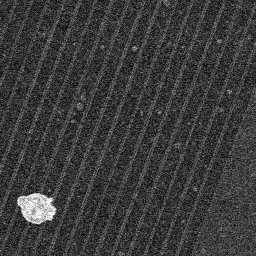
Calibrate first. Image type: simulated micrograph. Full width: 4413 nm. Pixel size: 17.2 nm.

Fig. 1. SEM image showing parallel lines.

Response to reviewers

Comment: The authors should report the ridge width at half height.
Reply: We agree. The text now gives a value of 0.0404 µm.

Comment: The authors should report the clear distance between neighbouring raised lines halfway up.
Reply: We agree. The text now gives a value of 0.218 microns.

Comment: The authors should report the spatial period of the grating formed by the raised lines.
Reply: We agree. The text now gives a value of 259 nm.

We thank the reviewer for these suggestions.